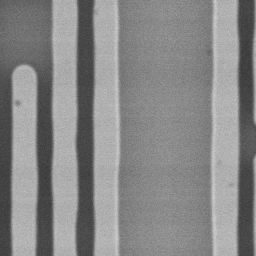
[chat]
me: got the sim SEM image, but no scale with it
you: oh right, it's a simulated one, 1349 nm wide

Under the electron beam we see groups of lines, slits or small figures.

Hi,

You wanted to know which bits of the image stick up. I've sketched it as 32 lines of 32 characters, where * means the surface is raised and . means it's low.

.......***..***............***..
.......***..***............***..
.......***..***............***..
.......***..***............***..
.......***..***............***..
.......***..***............***..
.......***..***............***..
.......***..***............***..
..**...***..***............***..
..**...***..***............***..
..**...***..***............***..
..**...***..***............***..
..**...***..***............***..
..**...***..***............***..
..**...***..***............***..
..**...***..***............***..
..**...***..***............***..
..**...**...***............***..
..**...**...***............***..
..**...***..***............***..
..***..***..***............***..
..***..***..***............***..
..***..***..***............***..
..***..***..***............***..
..***..***..***............***..
..**...***..***............***..
..**...***..***............***..
..**...***..***............***..
..**...**...***............***..
..**...**...***............***..
..**...**...***............***..
..**...***..***............***..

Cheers